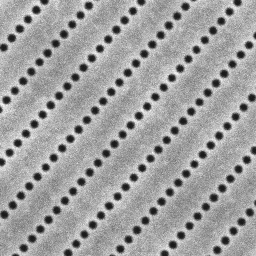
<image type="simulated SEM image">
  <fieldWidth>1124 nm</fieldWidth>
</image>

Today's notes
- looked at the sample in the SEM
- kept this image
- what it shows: a regular array of holes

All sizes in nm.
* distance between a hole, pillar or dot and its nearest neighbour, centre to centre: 54.4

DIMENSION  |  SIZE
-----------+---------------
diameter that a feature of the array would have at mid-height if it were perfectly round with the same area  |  36.4 nanometers